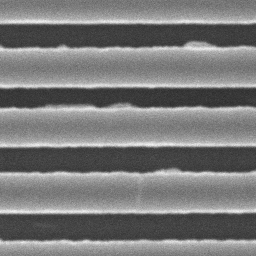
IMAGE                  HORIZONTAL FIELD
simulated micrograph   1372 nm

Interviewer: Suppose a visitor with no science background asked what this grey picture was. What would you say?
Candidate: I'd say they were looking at lines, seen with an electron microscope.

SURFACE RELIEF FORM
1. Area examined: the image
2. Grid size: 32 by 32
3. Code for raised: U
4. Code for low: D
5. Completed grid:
UUUUUUUUUUUUUUUUUUUUUUUUUUUUUUUU
UUUUUUUUUUUUUUUUUUUUUUUUUUUUUUUU
UUUUUUUUUUUUUUUUUUUUUUUUUUUUUUUU
DDDDDDDDDDDDDDDDDDDDDDDDDDDDDDDD
DDDDDDDDDDDDDDDDDDDDDDDDDDDDDDDD
DDDDDDDDDDDDDDDDDDDDDDDDDDDDDDDD
UUUUUUUUUUUUUUUUUUUUUUUUUUUUUUUU
UUUUUUUUUUUUUUUUUUUUUUUUUUUUUUUU
UUUUUUUUUUUUUUUUUUUUUUUUUUUUUUUU
UUUUUUUUUUUUUUUUUUUUUUUUUUUUUUUU
UUUUUUUUUUUUUUUUUUUUUUUUUUUUUUUU
DDDDDDDDDDDDDDDDDDDDDDDDDDDDDDDD
DDDDDDDDDDDDDDDDDDDDDDDDDDDDDDDD
DDDDDDDDDDDDDDDDUDDDDDDUUUDDDUUU
UUUUUUUUUUUUUUUUUUUUUUUUUUUUUUUU
UUUUUUUUUUUUUUUUUUUUUUUUUUUUUUUU
UUUUUUUUUUUUUUUUUUUUUUUUUUUUUUUU
UUUUUUUUUUUUUUUUUUUUUUUUUUUUUUUU
DDDDDDDDDDDDDDDDDDDDDDDDDDDDDDDD
DDDDDDDDDDDDDDDDDDDDDDDDDDDDDDDD
DDDDDDDDDDDDDDDDDDDDDDDDDDDDDDDD
DDDDDDDDDDDDDDDDDDDDDDDDDDDDDDDD
UUUUUUUUUUUUUUUUUUUUUUUUUUUUUUUU
UUUUUUUUUUUUUUUUUUUUUUUUUUUUUUUU
UUUUUUUUUUUUUUUUUUUUUUUUUUUUUUUU
UUUUUUUUUUUUUUUUUUUUUUUUUUUUUUUU
UUUUUUUUUUUUUUUUUUUUUUUUUUUUUUUU
DDDDDDDDDDDDDDDDDDDDDDDDDDDDDDDD
DDDDDDDDDDDDDDDDDDDDDDDDDDDDDDDD
DDDDDDDDDDDDDDDDDDDDDDDDDDDDDDDD
UUUUUUUUUUUUUUUUUUUUUUUUUUUUUUUU
UUUUUUUUUUUUUUUUUUUUUUUUUUUUUUUU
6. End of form